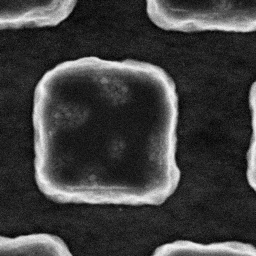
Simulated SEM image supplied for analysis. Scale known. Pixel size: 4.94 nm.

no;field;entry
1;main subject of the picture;raised bodies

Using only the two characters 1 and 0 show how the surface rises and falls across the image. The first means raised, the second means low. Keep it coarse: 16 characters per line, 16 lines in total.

1111000000111111
0000000000000111
0000000000000000
0000000000000000
0001111111000000
0001111111100000
0011111111100000
0011111111100000
0001111111100000
0001111111100000
0011111111100000
0001111111100000
0000000000000000
0000000000000000
0000000000000000
1111000000011100